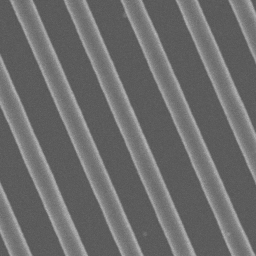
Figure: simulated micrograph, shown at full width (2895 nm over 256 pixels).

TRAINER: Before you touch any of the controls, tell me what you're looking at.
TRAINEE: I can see lines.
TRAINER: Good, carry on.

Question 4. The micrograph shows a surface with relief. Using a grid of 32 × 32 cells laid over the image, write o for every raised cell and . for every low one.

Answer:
.ooo....ooo....ooo....ooo....oo.
..ooo....oo.....oo.....oo....ooo
..ooo....ooo....ooo....ooo....oo
...ooo...ooo.....oo.....oo....oo
...ooo....ooo....ooo....ooo....o
....oo....ooo....ooo....ooo....o
....ooo....oo.....ooo....oo....o
.....oo....ooo....ooo....ooo....
o....ooo....oo.....oo.....oo....
o....ooo....ooo....ooo....ooo...
oo....ooo...ooo.....oo.....oo...
oo....ooo....ooo....ooo....ooo..
oo.....oo....ooo.....oo....ooo..
ooo....ooo....ooo....ooo....ooo.
.oo.....oo....ooo....ooo....ooo.
.ooo....ooo....oo.....ooo....oo.
..oo.....oo....ooo....ooo....ooo
..ooo....ooo....oo.....oo.....oo
..ooo....ooo....ooo....ooo....oo
...oo.....oo....ooo.....oo.....o
...ooo....ooo....oo.....ooo....o
....oo.....oo....ooo.....oo....o
....ooo....ooo....oo.....ooo....
.....oo....ooo....ooo....ooo....
o....ooo....ooo....oo.....oo....
o....ooo....ooo....ooo....ooo...
oo....ooo....ooo...ooo.....oo...
oo....ooo....ooo....ooo....ooo..
oo.....oo.....oo....ooo....ooo..
ooo....ooo....ooo....oo.....ooo.
.oo.....oo.....oo....ooo....ooo.
.ooo....ooo....ooo....oo.....ooo